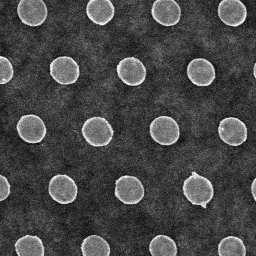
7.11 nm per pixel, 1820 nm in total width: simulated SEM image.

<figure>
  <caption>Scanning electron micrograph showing a regular array of raised bodies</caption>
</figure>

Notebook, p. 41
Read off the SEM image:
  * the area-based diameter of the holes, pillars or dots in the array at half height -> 202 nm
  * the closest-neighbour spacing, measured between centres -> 474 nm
